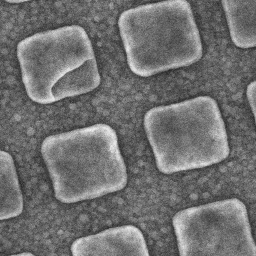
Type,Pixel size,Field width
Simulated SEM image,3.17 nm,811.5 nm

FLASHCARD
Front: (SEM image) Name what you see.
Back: raised bodies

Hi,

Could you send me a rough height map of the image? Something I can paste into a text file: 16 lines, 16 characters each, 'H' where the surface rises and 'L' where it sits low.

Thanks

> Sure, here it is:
LLLLLLLLHHHHLLHH
LLLLLLLLHHHHLLHH
LLHHHLLLHHHHLLLH
LHHHHHLLHHHHLLLL
LHHHHHLLHHLLLLLL
LLHHHHLLLLLLLLLL
LLLLLLLLLLLHHLLL
LLLLLLLLLHHHHHLL
LLLLHHHLLHHHHHLL
LLLHHHHLLLHHHHLL
HLLHHHHHLLHHLLLL
HLLHHHHHLLLLLLLL
HLLLHLLLLLLLLLLL
HLLLLLLLLLLHHHHL
LLLLLLHHHLLHHHHH
LLLLLHHHHLLHHHHH